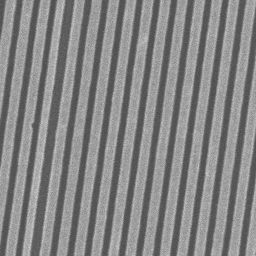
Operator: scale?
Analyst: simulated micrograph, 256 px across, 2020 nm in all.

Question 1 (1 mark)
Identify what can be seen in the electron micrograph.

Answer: parallel lines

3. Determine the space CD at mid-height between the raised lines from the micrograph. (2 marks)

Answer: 0.0596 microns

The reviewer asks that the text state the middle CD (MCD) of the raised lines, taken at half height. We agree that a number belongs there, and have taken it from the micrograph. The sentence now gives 0.0752 micrometres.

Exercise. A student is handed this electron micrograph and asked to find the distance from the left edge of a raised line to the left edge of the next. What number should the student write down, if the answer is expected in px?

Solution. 17